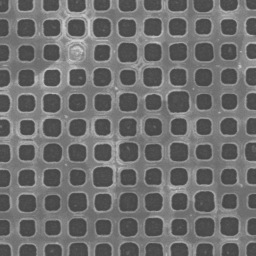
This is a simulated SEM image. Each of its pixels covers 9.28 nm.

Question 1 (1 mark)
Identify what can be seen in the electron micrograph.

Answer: a regular array of holes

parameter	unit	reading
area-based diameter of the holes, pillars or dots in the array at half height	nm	177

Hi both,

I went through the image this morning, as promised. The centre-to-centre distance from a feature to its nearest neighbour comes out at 24.7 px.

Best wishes